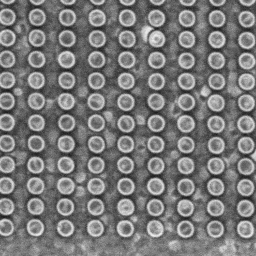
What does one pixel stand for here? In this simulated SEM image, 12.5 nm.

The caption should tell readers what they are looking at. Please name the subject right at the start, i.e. a regular array of raised bodies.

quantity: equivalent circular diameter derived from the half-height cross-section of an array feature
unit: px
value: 15.2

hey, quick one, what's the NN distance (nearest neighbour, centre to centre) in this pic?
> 261 nanometers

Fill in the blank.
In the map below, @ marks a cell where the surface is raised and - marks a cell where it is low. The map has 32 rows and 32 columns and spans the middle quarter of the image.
@@-----@@------@@-----@@------@@
--------------------------------
@------@@------@----------------
@@----@@@@----@@@----@@@@----@@@
@@----@@@@----@@@----@@@@----@@@
@@-----@@-----@@@-----@@@----@@@
--------------------------------
--------------------------------
@@-----@@@----@@@-----@@@----@@@
@@----@@@@----@@@----@@@@----@@@
@@----@@@@----@@@-----@@@----@@@
------------------------------@-
--------------------------------
@@-----@@@----@@@-----@@-----@@@
@@----@@@@----@@@----@@@@----@@@
@@----@@@@----@@@----@@@@----@@@
@-------------@@@-----@@-----@@@
--------------------------------
@@-----@@-----@@@-----@@--------
@@----@@@@----@@@----@@@@----@@@
@@----@@@@----@@@----@@@@----@@@
@@-----@@-----@@@-----@@-----@@@
--------------------------------
@-------------------------------
@@----@@@@----@@@----@@@-----@@@
@@----@@@@----@@@----@@@@----@@@
@@-----@@-----@@@-----@@-----@@@
--------------------------------
--------------------------------
@@----@@@-----@@@----@@@-----@@@
@@----@@@@----@@@----@@@@----@@@
@@----@@@@----@@@----@@@@----@@@